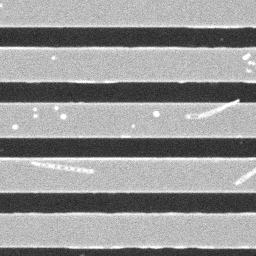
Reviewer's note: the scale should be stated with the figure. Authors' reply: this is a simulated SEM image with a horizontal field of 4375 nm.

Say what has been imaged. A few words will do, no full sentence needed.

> lines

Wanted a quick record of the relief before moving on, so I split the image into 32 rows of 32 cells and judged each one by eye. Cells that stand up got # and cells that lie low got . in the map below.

################################
################################
################################
................................
................................
................................
################################
################################
################################
################################
................................
................................
................................
################################
################################
################################
################################
................................
................................
................................
################################
################################
################################
################################
................................
................................
................................
################################
################################
################################
################################
................................